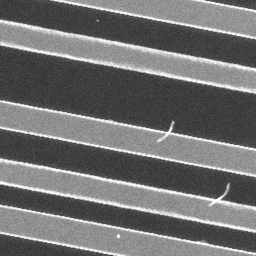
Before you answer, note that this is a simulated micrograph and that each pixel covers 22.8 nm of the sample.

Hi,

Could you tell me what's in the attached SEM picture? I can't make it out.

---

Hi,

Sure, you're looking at lines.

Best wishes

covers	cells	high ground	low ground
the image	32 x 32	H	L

LLLLLLLLLHHHHHHHHHHHHHHHHHHHLLLL
LLLLLLLLLLLLLLHHHHHHHHHHHHHHHHHH
LLLLLLLLLLLLLLLLLLLHHHHHHHHHHHHH
HHHHLLLLLLLLLLLLLLLLLLLLLHHHHHHH
HHHHHHHHHHLLLLLLLLLLLLLLLLLLLLHH
HHHHHHHHHHHHHHHLLLLLLLLLLLLLLLLL
LLLLLHHHHHHHHHHHHHHHLLLLLLLLLLLL
LLLLLLLLLLHHHHHHHHHHHHHHHLLLLLLL
LLLLLLLLLLLLLLLLLHHHHHHHHHHHHHHL
LLLLLLLLLLLLLLLLLLLLLHHHHHHHHHHH
LLLLLLLLLLLLLLLLLLLLLLLLLLHHHHHH
LLLLLLLLLLLLLLLLLLLLLLLLLLLLLLLL
LLLLLLLLLLLLLLLLLLLLLLLLLLLLLLLL
HHHHHLLLLLLLLLLLLLLLLLLLLLLLLLLL
HHHHHHHHHHLLLLLLLLLLLLLLLLLLLLLL
HHHHHHHHHHHHHHHLLLLLLLLLLLLLLLLL
LLHHHHHHHHHHHHHHHHHHHLLLLLLLLLLL
LLLLLLLLHHHHHHHHHHHHHHHHHHLLLLLL
LLLLLLLLLLLLLHHHHHHHHHHHHHHHHHHL
LLLLLLLLLLLLLLLLLLHHHHHHHHHHHHHH
HHHLLLLLLLLLLLLLLLLLLLLHHHHHHHHH
HHHHHHHHHLLLLLLLLLLLLLLLLLLLLHHH
HHHHHHHHHHHHHHLLLLLLLLLLLLLLLLLL
LLLHHHHHHHHHHHHHHHHLLLLLLLLLLLLL
LLLLLLLLLHHHHHHHHHHHHHHHLLLLLLLL
LLLLLLLLLLLLLLHHHHHHHHHHHHHHHLLL
HHHHHLLLLLLLLLLLLLLHHHHHHHHHHHHH
HHHHHHHHHHLLLLLLLLLLLLLLHHHHHHHH
HHHHHHHHHHHHHHHLLLLLLLLLLLLLLHHH
LLHHHHHHHHHHHHHHHHHHLLLLLLLLLLLL
LLLLLLLHHHHHHHHHHHHHHHHHHHLLLLLL
LLLLLLLLLLLLHHHHHHHHHHHHHHHHHHHL